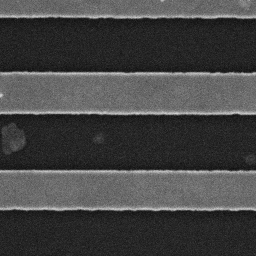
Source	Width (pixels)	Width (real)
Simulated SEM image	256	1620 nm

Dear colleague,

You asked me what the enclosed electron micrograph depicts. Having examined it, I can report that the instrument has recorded lines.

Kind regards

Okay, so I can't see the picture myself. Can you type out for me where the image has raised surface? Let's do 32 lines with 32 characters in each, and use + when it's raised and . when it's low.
++++++++++++++++++++++++++++++++
++++++++++++++++++++++++++++++++
................................
................................
................................
................................
................................
................................
................................
++++++++++++++++++++++++++++++++
++++++++++++++++++++++++++++++++
++++++++++++++++++++++++++++++++
++++++++++++++++++++++++++++++++
++++++++++++++++++++++++++++++++
................................
................................
................................
................................
................................
................................
................................
++++++++++++++++++++++++++++++++
++++++++++++++++++++++++++++++++
++++++++++++++++++++++++++++++++
++++++++++++++++++++++++++++++++
++++++++++++++++++++++++++++++++
................................
................................
................................
................................
................................
................................